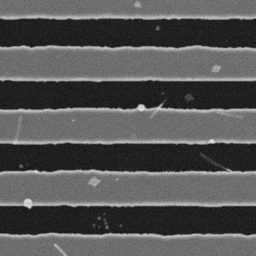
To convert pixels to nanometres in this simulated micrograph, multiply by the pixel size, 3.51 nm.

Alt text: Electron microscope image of lines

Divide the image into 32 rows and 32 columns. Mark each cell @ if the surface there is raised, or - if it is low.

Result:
@@@@@@@@@@@@@@@@@@@@@@@@@@@@@@@@
@@@@@@@@@@@@@@@@@@@@@@@@@@@@@@@@
--------------------------------
--------------------------------
--------------------------------
--------------------------------
@@@@@@@@@@@@@@@@@@@@@@@@@@@@@@@@
@@@@@@@@@@@@@@@@@@@@@@@@@@@@@@@@
@@@@@@@@@@@@@@@@@@@@@@@@@@@@@@@@
@@@@@@@@@@@@@@@@@@@@@@@@@@@@@@@@
--------------------------------
--------------------------------
--------------------------------
-----------------@-@------------
@@@@@@@@@@@@@@@@@@@@@@@@@@@@@@@@
@@@@@@@@@@@@@@@@@@@@@@@@@@@@@@@@
@@@@@@@@@@@@@@@@@@@@@@@@@@@@@@@@
@@@@@@@@@@@@@@@@@@@@@@@@@@@@@@@@
--------------------------------
--------------------------------
--------------------------------
@@@@@@@@@@@@@@@@@@@-@@@@@@-@@@@@
@@@@@@@@@@@@@@@@@@@@@@@@@@@@@@@@
@@@@@@@@@@@@@@@@@@@@@@@@@@@@@@@@
@@@@@@@@@@@@@@@@@@@@@@@@@@@@@@@@
@@@@@@@@@@@@@@@@@@@@@@@@@@@@@@@@
--------------------------------
--------------------------------
--------------------------------
@@@@@@@@@@@@@@@@@@@@@@@@@@@@@@@@
@@@@@@@@@@@@@@@@@@@@@@@@@@@@@@@@
@@@@@@@@@@@@@@@@@@@@@@@@@@@@@@@@